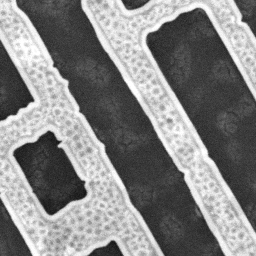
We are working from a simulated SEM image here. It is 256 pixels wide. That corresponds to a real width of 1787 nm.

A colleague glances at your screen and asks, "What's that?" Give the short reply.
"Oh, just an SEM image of one or a few lines or trenches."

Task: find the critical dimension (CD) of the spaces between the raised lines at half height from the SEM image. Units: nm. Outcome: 399